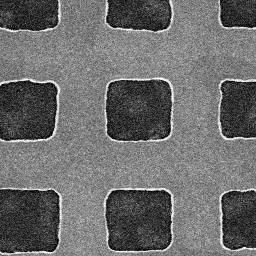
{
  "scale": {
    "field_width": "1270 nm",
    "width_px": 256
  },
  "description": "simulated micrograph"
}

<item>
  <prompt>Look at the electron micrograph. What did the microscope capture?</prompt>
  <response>holes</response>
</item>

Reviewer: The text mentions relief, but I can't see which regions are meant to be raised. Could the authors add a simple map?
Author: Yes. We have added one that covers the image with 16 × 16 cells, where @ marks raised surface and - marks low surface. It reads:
----@@@----@@@--
---@@@@----@@@--
@@@@@@@@@@@@@@@@
@@@@@@@@@@@@@@@@
@@@@@@@@@@@@@@@@
----@@@----@@@--
----@@@----@@@--
----@@@----@@@--
---@@@@---@@@@--
@@@@@@@@@@@@@@@@
@@@@@@@@@@@@@@@@
@@@@@@@@@@@@@@@@
----@@@----@@@--
----@@@----@@@--
----@@@----@@@--
---@@@@---@@@@--